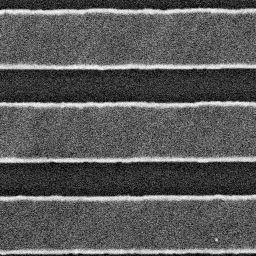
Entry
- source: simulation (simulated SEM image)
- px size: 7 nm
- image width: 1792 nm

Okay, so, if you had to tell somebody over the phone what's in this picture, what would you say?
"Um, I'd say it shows lines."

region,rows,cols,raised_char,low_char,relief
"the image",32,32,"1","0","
00000000000000000000000000000000
11111111111111111111111111111111
11111111111111111111111111111111
11111111111111111111111111111111
11111111111111111111111111111111
11111111111111111111111111111111
11111111111111111111111111111111
11111111111111111111111111111111
00000000000000000000000000000000
00000000000000000000000000000000
00000000000000000000000000000000
00000000000000000000000000000000
00000000000000000000000000000000
11111111111111111111111111111111
11111111111111111111111111111111
11111111111111111111111111111111
11111111111111111111111111111111
11111111111111111111111111111111
11111111111111111111111111111111
11111111111111111111111111111111
00000000000000000000000000000000
00000000000000000000000000000000
00000000000000000000000000000000
00000000000000000000000000000000
00000000000000000000000000000000
11111111111111111111111111111111
11111111111111111111111111111111
11111111111111111111111111111111
11111111111111111111111111111111
11111111111111111111111111111111
11111111111111111111111111111111
11111111110001110000110000000000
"